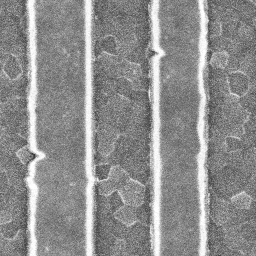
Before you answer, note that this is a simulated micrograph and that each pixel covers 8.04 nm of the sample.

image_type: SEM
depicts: one or a few lines or trenches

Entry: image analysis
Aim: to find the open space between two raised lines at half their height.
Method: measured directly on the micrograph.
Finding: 541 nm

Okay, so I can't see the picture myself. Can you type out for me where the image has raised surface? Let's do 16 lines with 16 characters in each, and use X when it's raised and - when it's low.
--XXX-----XXX---
--XXX-----XXX---
--XXX-----XXX---
--XXXX----XXX---
--XXXX----XXX---
--XXXX----XXX---
--XXXX----XXX---
--XXXX----XXX---
--XXXX----XXX---
--XXXX----XXX---
--XXXX----XXX---
--XXXX----XXX---
--XXXX----XXX---
--XXXX----XXX---
--XXXX----XXX---
--XXXX----XXX---